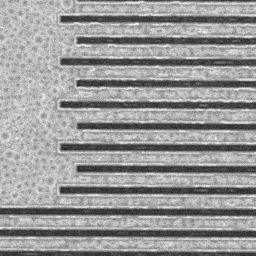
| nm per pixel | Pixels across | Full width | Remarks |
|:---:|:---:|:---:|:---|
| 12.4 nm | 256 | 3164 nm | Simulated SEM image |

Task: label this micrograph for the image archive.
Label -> parallel lines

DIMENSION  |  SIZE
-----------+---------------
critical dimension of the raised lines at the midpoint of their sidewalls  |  168 nm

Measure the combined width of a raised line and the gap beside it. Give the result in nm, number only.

266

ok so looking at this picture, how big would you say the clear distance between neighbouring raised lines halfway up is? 7.87 px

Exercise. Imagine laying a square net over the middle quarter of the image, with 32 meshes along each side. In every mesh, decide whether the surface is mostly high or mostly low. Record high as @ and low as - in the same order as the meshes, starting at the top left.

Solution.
-------------@------------------
@@@@@@@@@@@@@@@@@@@@@@@@@@@@@@@@
@@@@@@@@@@@@@@@@@@@@@@@@@@@@@@@@
@@@@@@@@@@@@@@@@@@@@@@@@@@@@@@@@
@@@-----------------------------
@@@-----------------------------
@@@@@@@@@@@@@@@@@@@@@@@@@@@@@@@@
@@@@@@@@@@@@@@@@@@@@@@@@@@@@@@@@
@@@@@@@@@@@@@@@@@@@@@@@@@@@@@@@@
--------------------------------
--------------------------------
@@@@@@@@@@@@@@@@@@@@@@@@@@@-----
@@@@@@@@@@@@@@@@@@@@@@@@@@@@@@@@
@@@@@@@@@@@@@@@@@@@@@@@@@@@@@@@@
@@@----------------@--------@-@-
@@@-----------------------------
@@@-----------------------------
@@@@@@@@@@@@@@@@@@@@@@@@@@@@@@@@
@@@@@@@@@@@@@@@@@@@@@@@@@@@@@@@@
@@@@@@@@@@@@@@@@@@@@@@@@@@@@@@@@
--------------------------------
--------------------------------
@@@@@@@@@@@@@@@@@@@@@@@@@@@@@@@@
@@@@@@@@@@@@@@@@@@@@@@@@@@@@@@@@
@@@@@@@@@@@@@@@@@@@@@@@@@@@@@@@@
@@@-----------------------------
@@@-----------------------------
@@@@@@@@@@@@@@@@@@@@@@@@@@@@@@@@
@@@@@@@@@@@@@@@@@@@@@@@@@@@@@@@@
@@@@@@@@@@@@@@@@@@@@@@@@@@@@@@@@
--------@-@@@@-@@---@@@@@@@-@-@@
--------------------------------